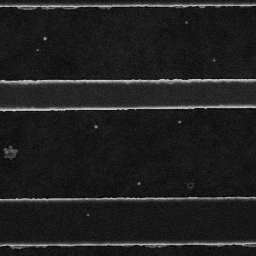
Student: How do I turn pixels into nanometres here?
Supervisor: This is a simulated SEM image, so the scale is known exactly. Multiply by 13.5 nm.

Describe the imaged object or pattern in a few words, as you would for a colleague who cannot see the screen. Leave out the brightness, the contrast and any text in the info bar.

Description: lines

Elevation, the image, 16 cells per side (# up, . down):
................
................
................
................
................
################
################
................
................
................
................
................
################
################
################
................